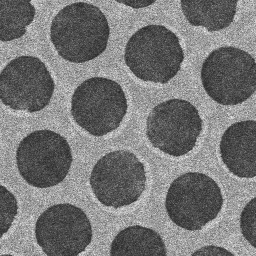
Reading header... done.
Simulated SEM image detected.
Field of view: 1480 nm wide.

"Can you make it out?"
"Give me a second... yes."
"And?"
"holes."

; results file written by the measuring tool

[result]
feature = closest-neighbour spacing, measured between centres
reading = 437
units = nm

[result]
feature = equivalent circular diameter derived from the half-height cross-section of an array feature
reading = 328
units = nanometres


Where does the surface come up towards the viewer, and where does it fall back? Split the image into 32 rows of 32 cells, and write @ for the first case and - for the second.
----@@@@@--@@@@----@@@@-------@@
----@@@------@@@@@@@@@@------@@@
----@@@------@@@@@@@@@@------@@@
---@@@--------@@@@---@@@@@--@@@@
---@@@--------@@@-----@@@@@@@@@@
@@@@@@@------@@@------@@@@@@@@@@
@@@@@@@------@@@-------@@@@----@
@@---@@@---@@@@@-------@@@------
@-----@@@@@@@@@@------@@@-------
------@@@@@@@@@@@-----@@@-------
-------@@@-----@@@@@@@@@@-------
-------@@------@@@@@@@@@@@------
------@@@-------@@@@@--@@@@----@
@----@@@@-------@@@-----@@@@@@@@
@@@@@@@@@-------@@@------@@@@@@@
@@@@@@@@@@-----@@@-------@@@@---
@@@@---@@@@---@@@@-------@@@----
@@@-----@@@@@@@@@@@------@@@----
@@-------@@@@@@@@@@@----@@@-----
@@-------@@@@----@@@@@-@@@@@----
@@-------@@@------@@@@@@@@@@----
@@-------@@-------@@@@@@@@@@@---
@@@-----@@@-------@@@@-----@@@@@
-@@@@@@@@@@-------@@@------@@@@@
--@@@@@@@@@@-----@@@@-------@@@@
--@@@@@--@@@@---@@@@@-------@@@-
--@@@-----@@@@@@@@@@@------@@@--
--@@@------@@@@@@@@@@-----@@@@--
-@@@-------@@@@@--@@@@@--@@@@@--
@@@@-------@@@@-----@@@@@@@@@@--
@@@@@------@@@------@@@@@@@@@@@-
@@@@@@----@@@@-------@@@-----@@@